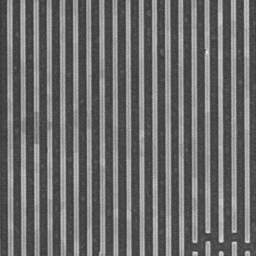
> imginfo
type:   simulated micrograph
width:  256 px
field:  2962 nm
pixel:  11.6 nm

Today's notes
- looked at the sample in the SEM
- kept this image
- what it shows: parallel lines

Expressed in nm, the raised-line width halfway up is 34.7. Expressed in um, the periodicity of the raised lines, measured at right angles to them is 0.152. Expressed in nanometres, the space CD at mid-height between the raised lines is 113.